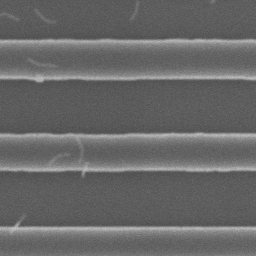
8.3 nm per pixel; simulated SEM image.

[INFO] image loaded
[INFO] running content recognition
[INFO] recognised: lines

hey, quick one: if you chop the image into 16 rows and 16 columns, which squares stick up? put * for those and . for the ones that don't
................
................
................
****************
****************
................
................
................
****************
****************
****************
................
................
................
****************
****************